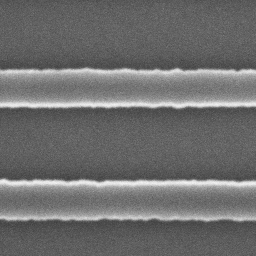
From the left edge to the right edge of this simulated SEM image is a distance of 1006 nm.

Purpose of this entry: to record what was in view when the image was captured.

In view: lines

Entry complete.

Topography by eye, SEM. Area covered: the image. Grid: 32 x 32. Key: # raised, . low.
................................
................................
................................
................................
................................
................................
................................
................................
................................
################################
################################
################################
################################
................................
................................
................................
................................
................................
................................
................................
................................
................................
................................
################################
################################
################################
################################
..............................#.
................................
................................
................................
................................